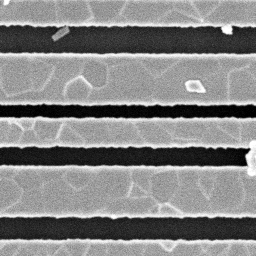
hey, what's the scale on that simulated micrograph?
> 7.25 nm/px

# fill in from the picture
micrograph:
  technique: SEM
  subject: lines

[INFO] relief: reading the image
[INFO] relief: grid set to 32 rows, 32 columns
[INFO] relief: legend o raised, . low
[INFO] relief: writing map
oooooooooooooooooooooooooooooooo
oooooooooooooooooooooooooooooooo
oooooooooooooooooooooooooooooooo
............................o...
................................
................................
................................
oooooooooooooooooooooooooooooooo
oooooooooooooooooooooooooooooooo
oooooooooooooooooooooooooooooooo
oooooooooooooooooooooooooooooooo
oooooooooooooooooooooooooooooooo
oooooooooooooooooooooooooooooooo
................................
................................
oooooooooooooooooooooooooooooooo
oooooooooooooooooooooooooooooooo
oooooooooooooooooooooooooooooooo
...................o......o.oooo
...............................o
...............................o
oooooooooooooooooooooooooooooooo
oooooooooooooooooooooooooooooooo
oooooooooooooooooooooooooooooooo
oooooooooooooooooooooooooooooooo
oooooooooooooooooooooooooooooooo
oooooooooooooooooooooooooooooooo
................................
................................
................................
oooooooooooooooooooooooooooooooo
oooooooooooooooooooooooooooooooo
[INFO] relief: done